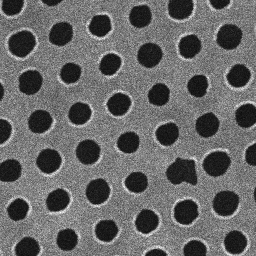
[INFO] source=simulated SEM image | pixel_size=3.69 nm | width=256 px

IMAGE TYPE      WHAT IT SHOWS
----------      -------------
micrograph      a regular array of holes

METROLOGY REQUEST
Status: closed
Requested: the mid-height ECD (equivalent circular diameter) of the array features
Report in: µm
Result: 0.0832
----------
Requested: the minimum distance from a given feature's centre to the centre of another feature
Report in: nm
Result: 147